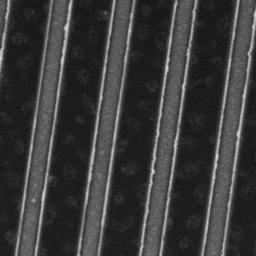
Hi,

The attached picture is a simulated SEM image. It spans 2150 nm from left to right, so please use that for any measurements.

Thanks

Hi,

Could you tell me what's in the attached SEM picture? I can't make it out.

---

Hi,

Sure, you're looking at one or a few lines or trenches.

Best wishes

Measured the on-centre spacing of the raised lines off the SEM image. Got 61.7 px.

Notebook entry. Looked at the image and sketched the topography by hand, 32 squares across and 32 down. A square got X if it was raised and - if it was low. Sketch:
-XXXXX---XXXXX---XXXXX--XXXXXX--
-XXXXX---XXXXX--XXXXXX--XXXXXX--
-XXXXX--XXXXXX--XXXXXX--XXXXXX--
-XXXXX--XXXXXX--XXXXXX--XXXXX---
XXXXXX--XXXXXX--XXXXX---XXXXX--X
XXXXXX--XXXXXX--XXXXX---XXXXX--X
XXXXXX--XXXXX---XXXXX--XXXXXX--X
XXXXX---XXXXX---XXXXX--XXXXXX--X
XXXXX---XXXXX---XXXXX--XXXXXX--X
XXXXX--XXXXXX--XXXXXX--XXXXXX--X
XXXXX--XXXXXX--XXXXXX--XXXXX---X
XXXXX--XXXXXX--XXXXX---XXXXX--XX
XXXXX--XXXXXX--XXXXX---XXXXX--XX
XXXXX--XXXXXX--XXXXX---XXXXX--XX
XXXX---XXXXX---XXXXX--XXXXXX--XX
XXXX---XXXXX--XXXXXX--XXXXXX--XX
XXXX---XXXXX--XXXXXX--XXXXXX--XX
XXXX--XXXXXX--XXXXXX--XXXXX---XX
XXXX--XXXXXX--XXXXXX--XXXXX---XX
XXXX--XXXXXX--XXXXX---XXXXX--XXX
XXXX--XXXXXX--XXXXX---XXXXX--XXX
XXXX--XXXXX---XXXXX--XXXXXX--XXX
XXX---XXXXX--XXXXXX--XXXXXX--XXX
XXX--XXXXXX--XXXXXX--XXXXXX--XXX
XXX--XXXXXX--XXXXXX--XXXXXX--XXX
XXX--XXXXXX--XXXXXX--XXXXX---XXX
XXX--XXXXXX--XXXXX---XXXXX---XXX
XXX--XXXXX---XXXXX---XXXXX--XXXX
XXX--XXXXX---XXXXX---XXXXX--XXXX
XX---XXXXX---XXXXX--XXXXXX--XXXX
XX---XXXXX--XXXXXX--XXXXXX--XXXX
XX--XXXXXX--XXXXXX--XXXXX---XXXX